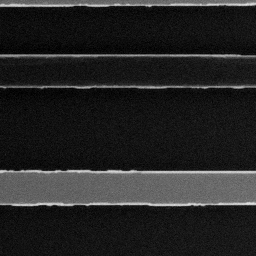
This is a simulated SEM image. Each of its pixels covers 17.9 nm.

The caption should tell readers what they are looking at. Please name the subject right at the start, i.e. lines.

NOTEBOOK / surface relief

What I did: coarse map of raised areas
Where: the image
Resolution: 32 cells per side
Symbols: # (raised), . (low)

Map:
################################
................................
................................
................................
................................
................................
................................
################################
################################
################################
################################
................................
................................
................................
................................
................................
................................
................................
................................
................................
................................
################################
################################
################################
################################
###############################.
................................
................................
................................
................................
................................
................................